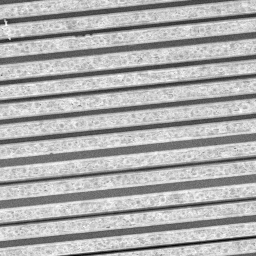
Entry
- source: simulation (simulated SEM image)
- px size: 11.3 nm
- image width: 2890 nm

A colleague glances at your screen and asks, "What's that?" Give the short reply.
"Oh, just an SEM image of parallel lines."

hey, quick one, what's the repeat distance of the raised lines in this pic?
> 227 nm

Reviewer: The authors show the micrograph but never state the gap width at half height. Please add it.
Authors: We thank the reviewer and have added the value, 80.1 nm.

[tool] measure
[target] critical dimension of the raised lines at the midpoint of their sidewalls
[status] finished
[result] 139 nm